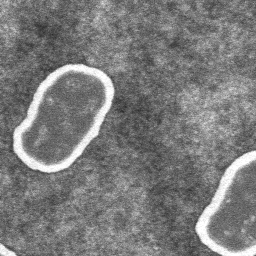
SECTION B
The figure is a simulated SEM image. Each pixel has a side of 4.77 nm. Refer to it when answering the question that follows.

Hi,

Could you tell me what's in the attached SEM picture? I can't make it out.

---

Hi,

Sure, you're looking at raised bodies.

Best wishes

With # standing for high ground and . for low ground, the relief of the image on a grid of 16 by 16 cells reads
................
................
................
................
....##..........
...####.........
..#####.........
..####..........
.#####..........
.####...........
...............#
..............##
..............##
.............###
.............###
.............###